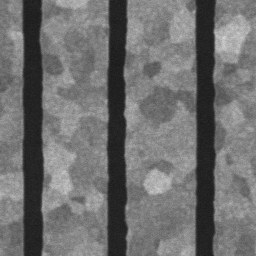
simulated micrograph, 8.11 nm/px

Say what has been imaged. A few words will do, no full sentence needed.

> lines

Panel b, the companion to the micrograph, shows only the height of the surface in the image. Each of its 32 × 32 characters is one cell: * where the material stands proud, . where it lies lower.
***..********...********...*****
***..********...********...*****
***..********...********...*****
***..********...********...*****
***..*********..********...*****
***..********...********...*****
***..********...********...*****
***..********...********...*****
***..********...********...*****
***..********...********...*****
***..********...********...*****
***..********...********...*****
***..********...********...*****
***..********...********...*****
***..********...********...*****
***..********...********...*****
***..********...********...*****
***..********...********...*****
***..********...********...*****
***..********...********...*****
***...*******...********...*****
***...*******...********...*****
***..********...********...*****
***..********...********...*****
***..********...********...*****
***..********...********...*****
***..********...********...*****
***..********...********...*****
***..********...********...*****
***..********...********...*****
***..********...********...*****
***..********...********...*****